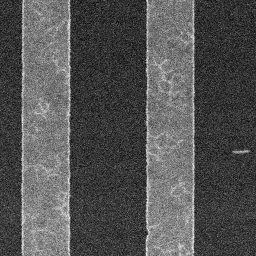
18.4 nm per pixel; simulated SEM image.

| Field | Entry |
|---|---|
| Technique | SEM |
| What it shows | one or a few lines or trenches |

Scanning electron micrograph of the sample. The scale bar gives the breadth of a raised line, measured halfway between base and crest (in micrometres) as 0.853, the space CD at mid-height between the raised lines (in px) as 77.8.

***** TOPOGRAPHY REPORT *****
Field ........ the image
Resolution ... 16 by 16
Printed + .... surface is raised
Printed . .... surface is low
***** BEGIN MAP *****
.+++.....+++....
.+++.....+++....
.+++.....+++....
.+++.....+++....
.+++.....+++....
.+++.....+++....
.+++.....+++....
.+++.....+++....
.+++.....+++....
.+++.....+++....
.+++.....+++....
.+++.....+++....
.+++.....+++....
.+++.....+++....
.+++.....+++....
.+++.....+++....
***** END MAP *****